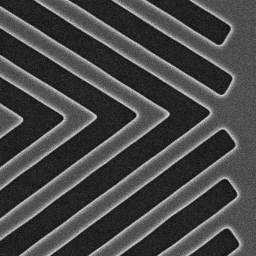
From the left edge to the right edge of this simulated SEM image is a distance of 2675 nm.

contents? groups of lines, slits or small figures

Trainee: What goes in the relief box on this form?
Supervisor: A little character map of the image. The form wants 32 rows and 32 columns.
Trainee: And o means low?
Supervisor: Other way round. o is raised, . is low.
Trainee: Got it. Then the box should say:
.....oooo......oooo.....oooooooo
o......oooo.....ooooo.....oooooo
ooo.....oooo......oooo......oooo
oooo......oooo.....ooooo.....ooo
..oooo.....ooooo.....oooo...oooo
...ooooo.....oooo......oooo.oooo
.....oooo......oooo.....oooooooo
o......oooo.....oooo......oooooo
oo......oooo......oooo......oooo
oooo......oooo.....ooooo.....ooo
..oooo.....oooo......oooo....ooo
...oooo......oooo......oooo.oooo
.....oooo......oooo.....oooooooo
o.....ooooo.....oooo......oooooo
oo......oooo.....oooo.....oooooo
oo.....oooo.....oooo.....ooooooo
o.....oooo.....ooo.....oooo.oooo
.....ooo.....oooo.....oooo...ooo
...oooo.....oooo.....ooo.....ooo
..oooo.....ooo.....oooo.....oooo
.ooo.....oooo.....oooo.....ooooo
ooo.....oooo.....ooo.....ooooooo
oo.....ooo.....oooo.....oooooooo
.....oooo.....oooo.....ooo...ooo
....oooo.....ooo.....oooo.....oo
..oooo.....oooo.....oooo.....ooo
.oooo.....oooo.....ooo.....ooooo
oooo....oooo.....oooo.....oooooo
oo.....oooo.....oooo....oooooooo
o.....oooo....oooo.....oooo..ooo
....oooo.....oooo.....oooo....oo
...oooo.....oooo....oooo.....ooo